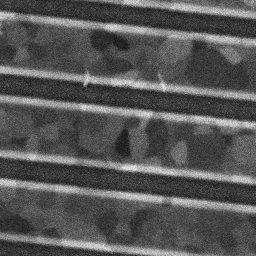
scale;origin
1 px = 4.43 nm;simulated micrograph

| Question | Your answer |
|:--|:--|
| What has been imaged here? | one or a few lines or trenches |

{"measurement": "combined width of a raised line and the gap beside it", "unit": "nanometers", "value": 366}